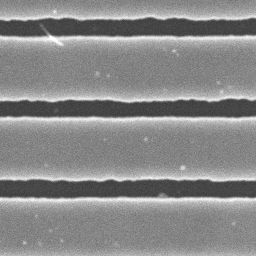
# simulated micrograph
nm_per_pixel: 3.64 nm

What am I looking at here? lines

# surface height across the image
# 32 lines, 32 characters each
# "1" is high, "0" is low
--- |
11111111111111111111111111111111
11111111111111111111111111111111
10100000000000000000000011000000
00000000000000000000000000000000
00000000000000000000000000000011
11111111111111111111111111111111
11111111111111111111111111111111
11111111111111111111111111111111
11111111111111111111111111111111
11111111111111111111111111111111
11111111111111111111111111111111
11111111111111111111111111111111
11101111000000111111110001100000
00000000000000000000000000000000
00000000000000000000000000000000
11111111111111111111111111111111
11111111111111111111111111111111
11111111111111111111111111111111
11111111111111111111111111111111
11111111111111111111111111111111
11111111111111111111111111111111
11111111111111111111111111111111
00000010111010110000000000111000
00000000000000000000000000000000
00000000000000000000000000000000
11111111111111111111111111111111
11111111111111111111111111111111
11111111111111111111111111111111
11111111111111111111111111111111
11111111111111111111111111111111
11111111111111111111111111111111
11111111111111111111111111111111